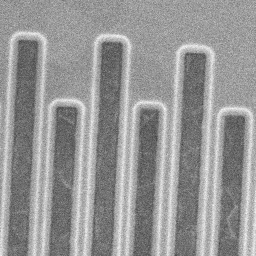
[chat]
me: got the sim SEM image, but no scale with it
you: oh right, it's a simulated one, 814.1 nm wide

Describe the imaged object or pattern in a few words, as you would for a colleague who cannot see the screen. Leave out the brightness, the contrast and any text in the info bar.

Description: parallel lines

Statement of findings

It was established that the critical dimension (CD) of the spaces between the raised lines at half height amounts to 88.4 nm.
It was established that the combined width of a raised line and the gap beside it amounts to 134 nanometers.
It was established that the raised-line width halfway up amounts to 44.4 nm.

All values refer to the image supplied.